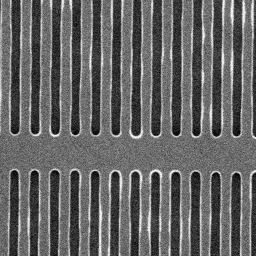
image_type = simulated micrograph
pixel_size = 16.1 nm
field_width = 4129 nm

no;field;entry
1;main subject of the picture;groups of lines, slits or small figures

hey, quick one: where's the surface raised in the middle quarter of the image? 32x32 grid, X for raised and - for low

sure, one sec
XX--XXX--XXX--XXX---XX--XXX---XX
XX--XXX--XXX--XXX---XX--XXX---XX
XX--XXX--XXX--XXX---XX--XXX---XX
XX--XXX--XXX--XXX--XXX--XXX---XX
XX--XXX--XXX--XXX--XXX--XXX--XXX
XX--XXX--XXX--XXX--XXX--XXX--XXX
XX--XXX--XXX--XXX--XXX--XXX--XXX
XX--XXX--XXX--XXX--XXX--XXX--XXX
XX--XXX--XXX--XXX--XXX--XXX---XX
XX--XXX--XXX--XXX--XXX---XX---XX
XX--XXX--XXX--XXX--XXX---XX---XX
XX--XXX--XXX--XXX--XXX--XXX---XX
XX--XXX--XXX--XXX--XXX--XXX--XXX
XX--XXX--XXX--XXX--XXX--XXX--XXX
X---XXX--XXX--XXX--XXX--XXX--XXX
X---XXX--XXX--XXX--XXX--XXX--XXX
XX--XXX--XXX--XXX--XXX--XXX--XXX
XX--XXX--XXX--XXX--XXX--XXX--XXX
XXXXXXXXXXXXXXXXXXXXXXXXXXXXXXXX
XXXXXXXXXXXXXXXXXXXXXXXXXXXXXXXX
XXXXXXXXXXXXXXXXXXXXXXXXXXXXXXXX
XXXXXXXXXXXXXXXXXXXXXXXXXXXXXXXX
XXXXXXXXXXXXXXXXXXXXXXXXXXXXXXXX
XXXXXXXXXXXXXXXXXXXXXXXXXXXXXXXX
XXXXXXXXXXXXXXXXXXXXXXXXXXXXXXXX
XXXXXXXXXXXXXXXXXXXXXXXXXXXXXXXX
XXXXXXXXXXXXXXXXXXXXXXXXXXXXXXXX
X---XXX--XXX--XXX--XXX--XXX--XXX
X---XXX--XXX--XXX--XXX--XXX--XXX
X---XXX--XXX--XXX--XXX--XXX--XXX
X---XXX--XX---XXX--XXX--XXX--XXX
X---XXX--XXX--XXX--XXX--XXX--XXX